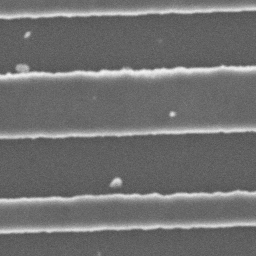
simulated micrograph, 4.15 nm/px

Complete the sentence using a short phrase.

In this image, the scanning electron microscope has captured lines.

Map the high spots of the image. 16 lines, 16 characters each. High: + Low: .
++++++++++++++++
................
................
................
......++++++++++
++++++++++++++++
++++++++++++++++
++++++++++++++++
++++............
................
................
................
++++++++++++++++
++++++++++++++++
+...............
................